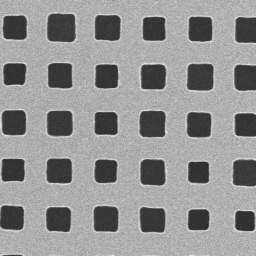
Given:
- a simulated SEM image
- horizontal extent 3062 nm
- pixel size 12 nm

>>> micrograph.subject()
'a regular array of holes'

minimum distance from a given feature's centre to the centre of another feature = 552 nanometres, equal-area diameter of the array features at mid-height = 327 nm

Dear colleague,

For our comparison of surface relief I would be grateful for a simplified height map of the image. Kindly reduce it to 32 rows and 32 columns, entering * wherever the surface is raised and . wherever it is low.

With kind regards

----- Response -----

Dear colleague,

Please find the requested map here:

********************************
********************************
...***...***...***...***..***...
...***...***...***...***...**...
...***...***...***...***...**...
********************************
********************************
********************************
...***...***...***...**....**...
...***...***...***...**....**...
*..***...***...***...**....**...
********************************
********************************
********************************
...***...***...***...**...***...
...***...***...**....**...***...
...***...***...***...**...***...
********************************
********************************
********************************
...***...***...***...***..***...
...***...***...***...***..***...
...***...***..****...***..***...
********************************
********************************
********************************
...***...***...***...***..****.*
...***...***...**....**...***...
...***...***...***...***..****..
********************************
********************************
********************************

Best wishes